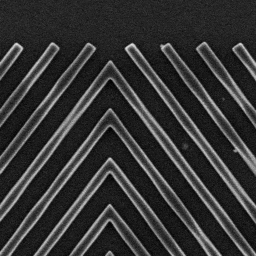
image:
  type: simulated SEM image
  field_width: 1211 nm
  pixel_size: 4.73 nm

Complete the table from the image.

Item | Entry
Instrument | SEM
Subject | groups of lines, slits or small figures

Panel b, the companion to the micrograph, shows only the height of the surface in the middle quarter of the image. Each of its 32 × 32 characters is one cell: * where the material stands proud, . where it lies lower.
..***.....***......***.....****.
.***......***......***......***.
***......*****......***......***
**......*******......***......**
**.....****.****......***.....**
*......***...***......***......*
......***.....***......***......
.....***.......***......***.....
.....**.........**.......***....
....**..........***......***....
...***...........***......***...
...**......*......**.......***..
..**......***......**.......***.
.**.......***.......**......***.
**.......*****......***......***
**......*******......***......**
*......****..***......**......**
.......***...***......***......*
......***.....***......***......
.....***.......***......***.....
.....**.........***......***....
....**..........***......***....
...***...........***......***...
..***.............***......***..
.***.......*.......***......**..
.**.......***......***......***.
***......*****......***......***
**......***.***......***......**
*.......**...***......***......*
.......**.....**......***......*
......***.....***......***......
.....***.......***......***.....